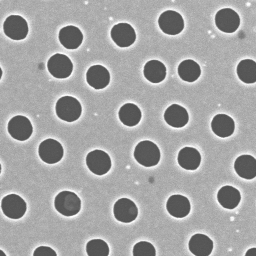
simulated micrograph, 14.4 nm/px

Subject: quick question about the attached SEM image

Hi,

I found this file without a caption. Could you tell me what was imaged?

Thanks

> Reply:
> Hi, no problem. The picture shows a regular array of holes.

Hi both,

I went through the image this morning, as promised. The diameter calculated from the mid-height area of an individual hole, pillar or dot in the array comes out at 361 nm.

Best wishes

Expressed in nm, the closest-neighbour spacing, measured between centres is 635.